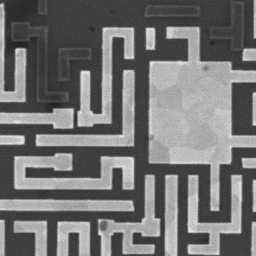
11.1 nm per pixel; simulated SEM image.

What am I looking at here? wiring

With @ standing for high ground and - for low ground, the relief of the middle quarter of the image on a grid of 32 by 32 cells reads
@---------@@----------@@@@@@@@@@
@---------@@----------@@@@@@@@@@
@---@@----@@---@@-----@@@@@@@@@@
@---@@----@@---@@-----@@@@@@@@@@
----@@----@@---@@-----@@@@@@@@@@
----@@----@@---@@-----@@@@@@@@@@
----@@----@@---@@-----@@@@@@@@@@
@---@@----@@---@@-----@@@@@@@@@@
@---@@----@@---@@-----@@@@@@@@@@
----@@----@@---@@-----@@@@@@@@@@
----@@----@@---@@-----@@@@@@@@@@
@@--@@@---@@---@@----@@@@@@@@@@@
@@--@@@@-@@@---@@----@@@@@@@@@@@
@@--@@@@@@@@---@@----@@@@@@@@@@@
@@--@@@@@@@@---@@----@@@@@@@@@@@
@@-------------@@----@@@@@@@@@@@
---------------@@----@@@@@@@@@@@
---------------@@----@@@@@@@@@@@
@@@@@@@@@@@@@@@@@----@@@@@@@@@@@
@@@@@@@@@@@@@@@@@----@@@@@@@@@@@
---------------------@@@@@@@@@@@
---------------------@@@@@@@@@@@
---------------------@@@@@@@@@@@
@@-------@@@@@@@@----@@@@@@@@@@@
@@-------@@@@@@@@----@@@@@@@@@@@
@@-------@@@@@@@@---------------
---------@@@---@@---------------
---------@@@---@@---------------
---------@@@---@@---@@@---@@---@
@@@@@@@@@@@@---@@---@@@---@@---@
@@@@@@@@@@@@---@@---@@@---@@---@
--------------------@@@---@@---@